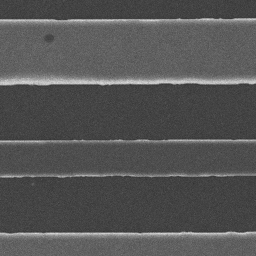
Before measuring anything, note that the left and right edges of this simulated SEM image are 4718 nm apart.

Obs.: lines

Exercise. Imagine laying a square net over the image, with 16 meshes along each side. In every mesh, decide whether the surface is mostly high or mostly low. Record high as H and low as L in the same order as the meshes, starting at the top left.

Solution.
LLLLLLLLLLLLLLLL
HHHHHHHHHHHHHHHH
HHHHHHHHHHHHHHHH
HHHHHHHHHHHHHHHH
HHHHHHHHHHHHHHHH
LLLLLLLLLLLLLLLL
LLLLLLLLLLLLLLLL
LLLLLLLLLLLLLLLL
LLLLLLLLLLLLLLLL
HHHHHHHHHHHHHHHH
HHHHHHHHHHHHHHHH
LLLLLLLLLLLLLLLL
LLLLLLLLLLLLLLLL
LLLLLLLLLLLLLLLL
LLLLLLLLLLLLLLLL
HHHHHHHHHHHHHHHH